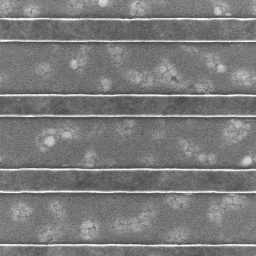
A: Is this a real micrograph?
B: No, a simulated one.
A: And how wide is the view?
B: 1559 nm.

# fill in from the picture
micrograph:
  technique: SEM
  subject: one or a few lines or trenches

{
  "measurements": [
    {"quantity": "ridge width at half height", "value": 137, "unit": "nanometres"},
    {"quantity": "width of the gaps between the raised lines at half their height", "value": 323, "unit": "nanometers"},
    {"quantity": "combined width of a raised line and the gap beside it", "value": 0.459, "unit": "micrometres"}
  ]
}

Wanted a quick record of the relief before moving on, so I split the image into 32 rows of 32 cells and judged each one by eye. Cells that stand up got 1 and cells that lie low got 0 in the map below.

00000000000000000000000000000000
00000000000000000000000000000000
11111111111111111111111111111111
11111111111111111111111111111111
11111111111111111111111111111111
00000000000000000000000000000000
00000000000000000000000000000000
00000000000000000000000000000000
00000000000000000000000000000000
00000000000000000000000000000000
00000000000000000000000000000000
00000000000000000000000000000000
11111111111111111111111111111111
11111111111111111111111111111111
00000001111111111111111111111111
00000000000000000000000000000000
00000000000000000000000000000000
00000000000000000000000000000000
00000000000000000000000000000000
00000000000000000000000000000000
00000000000000000000000000000000
11111111111111111111111111111111
11111111111111111111111111111111
11111111111111111111111111111111
00000000000000000000000000000000
00000000000000000000000000000000
00000000000000000000000000000000
00000000000000000000000000000000
00000000000000000000000000000000
00000000000000000000000000000000
00000000000000000000000000000000
11111111111111111111111111111111